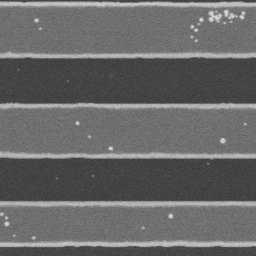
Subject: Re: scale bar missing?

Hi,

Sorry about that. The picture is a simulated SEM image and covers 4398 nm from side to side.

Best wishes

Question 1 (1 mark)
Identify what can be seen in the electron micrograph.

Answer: lines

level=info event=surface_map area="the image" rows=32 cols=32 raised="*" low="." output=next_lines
********************************
********************************
********************************
********************************
********************************
********************************
********************************
................................
................................
................................
................................
................................
................................
********************************
********************************
********************************
********************************
********************************
********************************
********************************
................................
................................
................................
................................
................................
********************************
********************************
********************************
********************************
********************************
********************************
................................